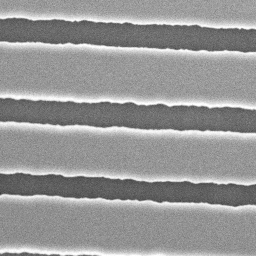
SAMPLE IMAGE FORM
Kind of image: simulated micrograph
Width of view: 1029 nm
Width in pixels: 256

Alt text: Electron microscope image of lines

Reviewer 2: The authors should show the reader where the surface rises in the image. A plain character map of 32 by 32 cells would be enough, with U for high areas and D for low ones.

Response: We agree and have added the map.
UUUUUUUUUUUUUUUUUUUUUUUUUUUUUUUU
UUUUUUUUUUUUUUUUUUUUUUUUUUUUUUUU
DDDDUDDDUUUUUUUUUUUUUUUUUUUUUUUU
DDDDDDDDDDDDDDDDDDDDDDDDDDDDDDUU
DDDDDDDDDDDDDDDDDDDDDDDDDDDDDDDD
UUUUUUDDDDDDDDDDDDDDDDDDDDDDDDDD
UUUUUUUUUUUUUUUUUUUUUUUUUUUUUUDD
UUUUUUUUUUUUUUUUUUUUUUUUUUUUUUUU
UUUUUUUUUUUUUUUUUUUUUUUUUUUUUUUU
UUUUUUUUUUUUUUUUUUUUUUUUUUUUUUUU
UUUUUUUUUUUUUUUUUUUUUUUUUUUUUUUU
UUUUUUUUUUUUUUUUUUUUUUUUUUUUUUUU
DDDDUDUUUUUUUUUUUUUUUUUUUUUUUUUU
DDDDDDDDDDDDDDDDDDDDDDDDDDDDDDDU
DDDDDDDDDDDDDDDDDDDDDDDDDDDDDDDD
UUUUDDDDDDDDDDDDDDDDDDDDDDDDDDDD
UUUUUUUUUUUUUUUUUUUUUUUUUUUUUDDD
UUUUUUUUUUUUUUUUUUUUUUUUUUUUUUUU
UUUUUUUUUUUUUUUUUUUUUUUUUUUUUUUU
UUUUUUUUUUUUUUUUUUUUUUUUUUUUUUUU
UUUUUUUUUUUUUUUUUUUUUUUUUUUUUUUU
UUUUUUUUUUUUUUUUUUUUUUUUUUUUUUUU
DDDDDDDDDDDDDDDDDUUUUUUUUUUUUUUU
DDDDDDDDDDDDDDDDDDDDDDDDDDDDDDDD
UUUDUUDDDDDDDDDDDDDDDDDDDDDDDDDD
UUUUUUUUUUUUUUUUUUUUUUUUUUDDDDDD
UUUUUUUUUUUUUUUUUUUUUUUUUUUUUUUU
UUUUUUUUUUUUUUUUUUUUUUUUUUUUUUUU
UUUUUUUUUUUUUUUUUUUUUUUUUUUUUUUU
UUUUUUUUUUUUUUUUUUUUUUUUUUUUUUUU
UUUUUUUUUUUUUUUUUUUUUUUUUUUUUUUU
UUUDUUUUUUUUUUUUUUUUUUUUUUUUUUUU